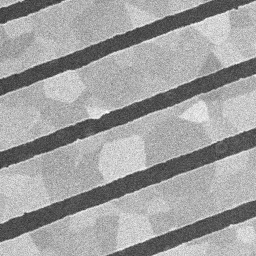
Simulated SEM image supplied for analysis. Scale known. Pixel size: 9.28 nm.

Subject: one or a few lines or trenches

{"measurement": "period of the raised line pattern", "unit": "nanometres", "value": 626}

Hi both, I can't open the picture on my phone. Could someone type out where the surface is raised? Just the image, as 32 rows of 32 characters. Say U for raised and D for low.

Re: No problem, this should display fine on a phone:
UDDDDDDUUUUUUUUUUUUUUUUUUDDDDDDU
DDDDDUUUUUUUUUUUUUUUUUDDDDDDUUUU
DDUUUUUUUUUUUUUUUUUDDDDDDDUUUUUU
UUUUUUUUUUUUUUUUUDDDDDDUUUUUUUUU
UUUUUUUUUUUUUUDDDDDDUUUUUUUUUUUU
UUUUUUUUUUUUDDDDDUUUUUUUUUUUUUUU
UUUUUUUUUDDDDDDUUUUUUUUUUUUUUUUU
UUUUUUUDDDDDUUUUUUUUUUUUUUUUUUUD
UUUUDDDDDDUUUUUUUUUUUUUUUUUUDDDD
UDDDDDDUUUUUUUUUUUUUUUUUUDDDDDDD
DDDDUUUUUUUUUUUUUUUUUUUDDDDDDUUU
DDUUUUUUUUUUUUUUUUUUDDDDDDUUUUUU
UUUUUUUUUUUUUUUUUUDDDDDDUUUUUUUU
UUUUUUUUUUUUUUUDDDDDDUUUUUUUUUUU
UUUUUUUUUUUUUDDDDDUUUUUUUUUUUUUU
UUUUUUUUUDDDDDDDUUUUUUUUUUUUUUUU
UUUUUUUDDDDDDUUUUUUUUUUUUUUUUUDD
UUUUDDDDDDUUUUUUUUUUUUUUUUUUDDDD
UDDDDDDUUUUUUUUUUUUUUUUUUDDUDDDD
DDDDDUUUUUUUUUUUUUUUUUDDDDDDDUUU
DDUUUUUUUUUUUUUUUUUUDDDDDDUUUUUU
UUUUUUUUUUUUUUUUUDDDDDDDUUUUUUUU
UUUUUUUUUUUUUUDDDDDDDUUUUUUUUUUU
UUUUUUUUUUUUDDDDDDUUUUUUUUUUUUUU
UUUUUUUUUDDDDDDDUUUUUUUUUUUUUUUU
UUUUUUDDDDDDDUUUUUUUUUUUUUUUUUDD
UUUDDDDDDDUUUUUUUUUUUUUUUUUUDDDD
UDDDDDDDUUUUUUUUUUUUUUUUUDDDDDDU
DDDDDUUUUUUUUUUUUUUUUUDDDDDDUUUU
DDDUUUUUUUUUUUUUUUUUDDDDDDUUUUUU
UUUUUUUUUUUUUUUUUDDDDDDUUUUUUUUU
UUUUUUUUUUUUUUDDDDDDDUUUUUUUUUUU